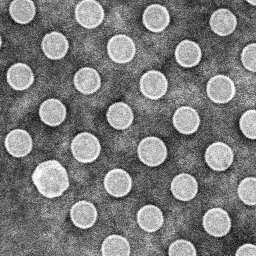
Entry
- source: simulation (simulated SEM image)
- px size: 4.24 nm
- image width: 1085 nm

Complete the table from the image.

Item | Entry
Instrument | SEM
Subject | a regular array of raised bodies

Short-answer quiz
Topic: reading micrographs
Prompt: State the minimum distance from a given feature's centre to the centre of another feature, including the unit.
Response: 197 nanometers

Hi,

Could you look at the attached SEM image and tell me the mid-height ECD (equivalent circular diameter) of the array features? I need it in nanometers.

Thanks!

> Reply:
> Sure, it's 111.